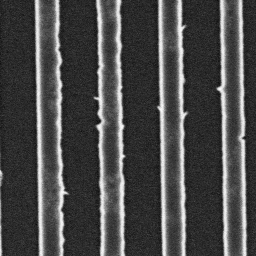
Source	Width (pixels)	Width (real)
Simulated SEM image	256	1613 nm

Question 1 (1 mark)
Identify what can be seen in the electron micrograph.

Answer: one or a few lines or trenches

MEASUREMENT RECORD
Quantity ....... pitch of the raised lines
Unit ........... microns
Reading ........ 0.387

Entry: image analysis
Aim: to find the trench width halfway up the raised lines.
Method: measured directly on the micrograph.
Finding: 254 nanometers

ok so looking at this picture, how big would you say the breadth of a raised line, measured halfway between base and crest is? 129 nm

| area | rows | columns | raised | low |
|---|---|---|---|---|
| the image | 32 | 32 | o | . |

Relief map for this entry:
.....oo.....ooo.....oo......oo..
.....oo.....ooo.....oo......oo..
.....oo.....ooo.....oo......oo..
.....oo.....ooo.....ooo.....oo..
.....oo.....ooo.....ooo.....oo..
.....oo.....ooo.....ooo.....oo..
.....oo.....ooo.....ooo.....oo..
.....oo.....ooo.....ooo.....oo..
.....oo.....ooo.....ooo.....oo..
.....oo......oo.....ooo.....oo..
.....oo.....ooo.....ooo.....oo..
.....ooo....ooo.....ooo.....oo..
.....ooo....ooo.....ooo.....oo..
.....oo......oo.....ooo.....oo..
.....ooo....ooo.....ooo.....oo..
.....oo......oo.....ooo.....oo..
.....oo......oo.....ooo.....oo..
.....oo......oo.....ooo.....oo..
.....oo.....ooo.....ooo.....oo..
.....ooo.....oo.....ooo.....oo..
.....ooo.....oo.....ooo.....oo..
.....ooo.....oo.....ooo.....oo..
.....ooo.....oo.....ooo.....oo..
.....ooo.....oo.....ooo.....ooo.
.....ooo.....oo.....ooo.....ooo.
.....ooo.....oo.....ooo.....ooo.
.....ooo.....oo.....ooo.....ooo.
.....ooo.....oo.....ooo.....ooo.
.....ooo.....oo.....ooo.....ooo.
.....ooo.....oo.....ooo.....ooo.
.....ooo.....oo.....ooo.....ooo.
.....ooo.....oo.....ooo.....ooo.